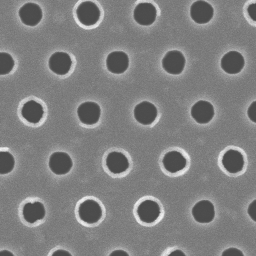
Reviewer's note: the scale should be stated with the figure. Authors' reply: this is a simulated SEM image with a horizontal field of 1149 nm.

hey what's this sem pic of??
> a regular array of holes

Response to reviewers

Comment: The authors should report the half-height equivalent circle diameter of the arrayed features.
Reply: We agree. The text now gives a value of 98.2 nm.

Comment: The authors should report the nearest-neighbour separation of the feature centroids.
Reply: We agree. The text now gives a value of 56.3 pixels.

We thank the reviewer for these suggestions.